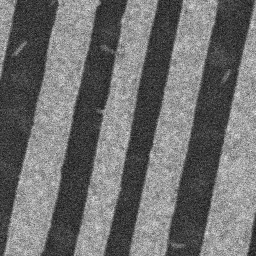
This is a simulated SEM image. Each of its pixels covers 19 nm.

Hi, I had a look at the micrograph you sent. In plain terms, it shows one or a few lines or trenches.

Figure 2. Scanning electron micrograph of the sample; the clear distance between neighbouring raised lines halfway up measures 613 nanometres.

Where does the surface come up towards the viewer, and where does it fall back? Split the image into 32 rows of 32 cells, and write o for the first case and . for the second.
oo.....ooooo....ooo....oooo.....
oo.....ooooo....ooo....oooo.....
o......ooooo...oooo....oooo....o
o......oooo....oooo...oooo.....o
o.....ooooo....oooo...oooo.....o
o.....ooooo....ooo....oooo.....o
o.....ooooo....ooo....oooo.....o
......ooooo....ooo....ooo.....oo
......oooo....oooo...oooo.....oo
......oooo....ooo....oooo.....oo
.....ooooo....ooo....oooo.....oo
.....ooooo....ooo....oooo.....oo
.....oooo.....ooo....ooo.....ooo
.....oooo....oooo...oooo.....ooo
....ooooo....oooo...oooo.....ooo
....ooooo....ooo....oooo.....ooo
....ooooo....ooo....oooo....oooo
....oooo.....ooo...oooo.....oooo
....oooo....oooo...oooo.....oooo
...ooooo....ooo....oooo.....oooo
...ooooo....ooo....oooo.....oooo
...oooo.....ooo....oooo....ooooo
...oooo....oooo...oooo.....ooooo
..ooooo....oooo...oooo.....ooooo
..ooooo....oooo...oooo.....ooooo
..ooooo....ooo....oooo.....ooooo
..oooo.....ooo....oooo....oooooo
..oooo....oooo...oooo.....oooooo
.ooooo....oooo...oooo.....ooooo.
.ooooo....ooo....oooo.....ooooo.
.ooooo....ooo....oooo.....ooooo.
.oooo....oooo...ooooo....oooooo.